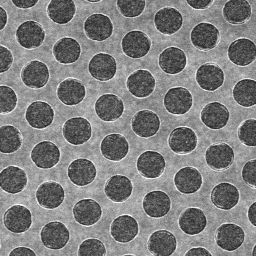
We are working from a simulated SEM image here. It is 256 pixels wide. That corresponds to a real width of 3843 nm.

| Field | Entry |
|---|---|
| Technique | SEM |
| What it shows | a regular array of holes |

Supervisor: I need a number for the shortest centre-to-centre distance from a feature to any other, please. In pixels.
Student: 39.4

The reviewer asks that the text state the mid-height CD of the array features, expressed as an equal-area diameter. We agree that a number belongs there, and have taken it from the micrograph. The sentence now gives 420 nm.